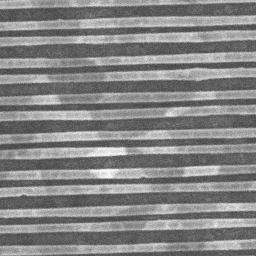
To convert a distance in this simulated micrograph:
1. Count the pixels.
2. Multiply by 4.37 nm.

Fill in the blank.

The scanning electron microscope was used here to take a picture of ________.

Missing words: parallel lines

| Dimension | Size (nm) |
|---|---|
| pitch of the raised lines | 81.9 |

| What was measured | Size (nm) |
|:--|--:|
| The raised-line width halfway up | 36.6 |